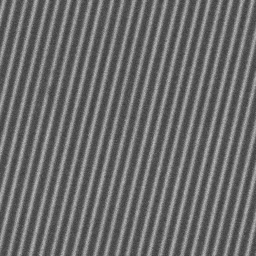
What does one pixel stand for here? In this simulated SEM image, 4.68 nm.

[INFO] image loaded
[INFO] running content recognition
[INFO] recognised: parallel lines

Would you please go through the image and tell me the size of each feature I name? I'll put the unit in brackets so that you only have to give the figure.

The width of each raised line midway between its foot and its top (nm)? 12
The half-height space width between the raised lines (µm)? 0.0364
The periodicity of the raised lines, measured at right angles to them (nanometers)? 49.3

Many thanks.